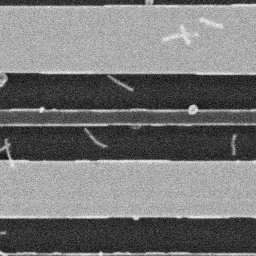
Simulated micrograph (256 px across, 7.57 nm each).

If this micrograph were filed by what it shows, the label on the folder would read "lines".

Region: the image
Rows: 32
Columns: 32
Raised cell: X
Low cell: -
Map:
--------------------------------
XXXXXXXXXXXXXXXXXXXXXXXXXXXXXXXX
XXXXXXXXXXXXXXXXXXXXXXXXXXXXXXXX
XXXXXXXXXXXXXXXXXXXXXXXXXXXXXXXX
XXXXXXXXXXXXXXXXXXXXXXXXXXXXXXXX
XXXXXXXXXXXXXXXXXXXXXXXXXXXXXXXX
XXXXXXXXXXXXXXXXXXXXXXXXXXXXXXXX
XXXXXXXXXXXXXXXXXXXXXXXXXXXXXXXX
XXXXXXXXXXXXXXXXXXXXXXXXXXXXXXXX
--------------------------------
--------------------------------
--------------------------------
--------------------------------
------------------------X-------
XXXXXXXXXXXXXXXXXXXXXXXXXXXXXXXX
XXXXXXXXXXXXXXXXXXXXXXXXXXXXXXXX
--------------------------------
--------------------------------
--------------------------------
--------------------------------
XXXXXXXXXXXXXXXXXXXXXXXXXXXXXXXX
XXXXXXXXXXXXXXXXXXXXXXXXXXXXXXXX
XXXXXXXXXXXXXXXXXXXXXXXXXXXXXXXX
XXXXXXXXXXXXXXXXXXXXXXXXXXXXXXXX
XXXXXXXXXXXXXXXXXXXXXXXXXXXXXXXX
XXXXXXXXXXXXXXXXXXXXXXXXXXXXXXXX
XXXXXXXXXXXXXXXXXXXXXXXXXXXXXXXX
--------------------------------
--------------------------------
--------------------------------
--------------------------------
--------------------------------